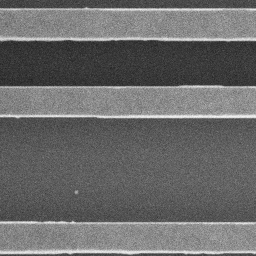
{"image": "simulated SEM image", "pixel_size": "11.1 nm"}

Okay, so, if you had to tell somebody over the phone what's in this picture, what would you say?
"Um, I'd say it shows lines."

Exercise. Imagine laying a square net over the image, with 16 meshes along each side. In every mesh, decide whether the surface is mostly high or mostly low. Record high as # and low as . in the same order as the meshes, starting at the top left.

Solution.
................
################
#######..#######
................
................
################
################
................
................
................
................
................
................
................
################
################